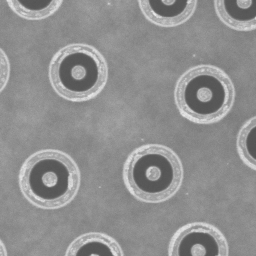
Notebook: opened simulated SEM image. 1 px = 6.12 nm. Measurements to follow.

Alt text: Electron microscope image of ring-shaped raised bodies with a dot in the middle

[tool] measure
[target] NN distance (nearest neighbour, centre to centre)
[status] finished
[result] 604 nanometers